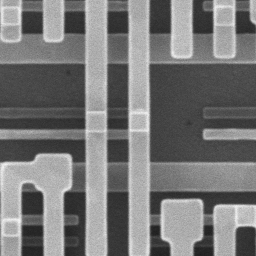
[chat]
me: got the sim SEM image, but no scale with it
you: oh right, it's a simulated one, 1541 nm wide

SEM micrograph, wiring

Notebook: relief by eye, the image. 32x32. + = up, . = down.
+++..+++...++...+++..+++...++..+
+++..+++...++...+++..+++...++..+
+++..+++...++...+++..+++...++..+
+++..+++...++...+++..+++...++...
+++..+++...++...+++..+++...++...
...........++...+++..+++...++...
...........++...+++..+++...++...
...........++...+++.............
...........++...+++.............
...........++...+++.............
...........++...+++.............
...........++...+++.............
...........++...+++.............
...........++...+++.............
...........++...+++.............
...........++...+++.............
...........++...+++.............
...........++...+++.............
...........++...+++.............
.....++++..++...+++.............
+++++++++..++...+++.............
+++++++++..++...+++.............
+++++++++..++...+++.............
+++..++++..++...+++.............
+++..+++...++...+++.............
+++...++...++...+++.+++++.......
+++...++...++...+++.+++++..+++++
+++...++...++...+++.+++++..+++++
+++...++...++...+++.+++++..+++..
+++...++...++...+++.+++++..++...
+++...++...++...+++..+++...++...
+++...++...++...+++..+++...++...